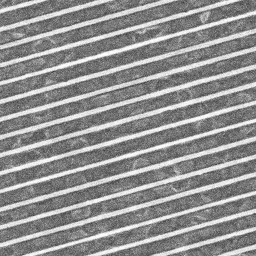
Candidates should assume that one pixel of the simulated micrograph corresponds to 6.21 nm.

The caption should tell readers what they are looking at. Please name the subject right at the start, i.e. parallel lines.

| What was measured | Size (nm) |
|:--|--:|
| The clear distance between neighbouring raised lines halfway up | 85.9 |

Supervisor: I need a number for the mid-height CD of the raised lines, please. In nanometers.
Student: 21